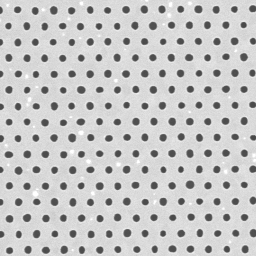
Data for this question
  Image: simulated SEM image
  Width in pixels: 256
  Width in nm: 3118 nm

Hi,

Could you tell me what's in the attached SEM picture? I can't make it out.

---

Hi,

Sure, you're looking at a regular array of holes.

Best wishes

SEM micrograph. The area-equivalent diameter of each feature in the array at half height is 0.0932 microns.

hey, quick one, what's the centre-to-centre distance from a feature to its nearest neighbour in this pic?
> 216 nm